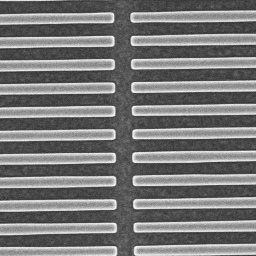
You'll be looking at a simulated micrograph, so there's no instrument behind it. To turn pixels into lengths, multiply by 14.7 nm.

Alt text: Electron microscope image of groups of lines, slits or small figures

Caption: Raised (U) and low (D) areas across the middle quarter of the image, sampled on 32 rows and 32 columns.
UUUUUUUUUUUUUDDDDUUUUUUUUUUUUUUU
UUUUUUUUDDDDDDDDDDDDDDDDDDDDDDDD
DDDDDDDDDDDDDDDDDDDDDDDDDDDDDDDD
DDDDDDDDDDDDDDDDDDDDDDDDDDDDDDDD
DDDDDDDDDDDDDDDDDDDDDDDDDDDDDUUU
UUUUUUUUUUUUUDDDDUUUUUUUUUUUUUUU
UUUUUUUUUUUUUDDDDUUUUUUUUUUUUUUU
DDDDDDDDDDDDDDDDDDDDDDDDDDDDDDDD
DDDDDDDDDDDDDDDDDDDDDDDDDDDDDDDD
DDDDDDDDDDDDDDDDDDDDDDDDDDDDDDDD
DDDDDDDDDDDDDDDDDUUUUUUUUUUUUUUU
UUUUUUUUUUUUUDDDDUUUUUUUUUUUUUUU
UUUUUUUUUUUUUDDDDUUUUUUUUUUUUUUU
DDDDDDDDDDDDDDDDDDDDDDDDDDDDDDDD
DDDDDDDDDDDDDDDDDDDDDDDDDDDDDDDD
DDDDDDDDDDDDDDDDDDDDDDDDDDDDDDDD
DDDDDDDDDDDDDDDDDDDDUUUUUUUUUUUU
UUUUUUUUUUUUUDDDDUUUUUUUUUUUUUUU
UUUUUUUUUUUUUDDDDUUUUUUUUUUUUUUU
DDDDDDDDDDDDDDDDDDDDDDDDDDDDDDDD
DDDDDDDDDDDDDDDDDDDDDDDDDDDDDDDD
DDDDDDDDDDDDDDDDDDDDDDDDDDDDDDDD
UUUUUUUUUUUUUDDDDUUUUUUUUUUUUUUU
UUUUUUUUUUUUUDDDDUUUUUUUUUUUUUUU
UUUUUUUUUUUUUDDDDUUUUUUUUUUUUUUU
DDDDDDDDDDDDDDDDDDDDDDDDDDDDDDDD
DDDDDDDDDDDDDDDDDDDDDDDDDDDDDDDD
DDDDDDDDDDDDDDDDDDDDDDDDDDDDDDDD
UUUUUUUUUUUUUDDDDUUUUUUUUUUUUUUU
UUUUUUUUUUUUUDDDDUUUUUUUUUUUUUUU
UUUUUUUUUDDDDDDDDDDDDDDDDDDDDDDD
DDDDDDDDDDDDDDDDDDDDDDDDDDDDDDDD